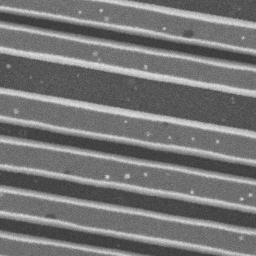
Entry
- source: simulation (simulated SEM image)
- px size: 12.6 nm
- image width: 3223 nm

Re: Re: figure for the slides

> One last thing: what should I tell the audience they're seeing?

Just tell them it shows lines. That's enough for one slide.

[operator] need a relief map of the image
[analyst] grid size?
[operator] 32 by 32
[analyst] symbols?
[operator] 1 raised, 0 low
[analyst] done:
11111111111111111000000000000000
00111111111111111111110000000000
00000000111111111111111111110000
11100000000000111111111111111111
11111111100000000001111111111111
11111111111111000000000001111111
01111111111111111111000000000001
00000001111111111111111111000000
00000000000001111111111111111111
00000000000000000011111111111111
00000000000000000000000011111111
11000000000000000000000000000011
11111111000000000000000000000000
11111111111110000000000000000000
11111111111111111110000000000000
00011111111111111111111110000000
00000000011111111111111111111110
11000000000000011111111111111111
11111111000000000000111111111111
11111111111111000000000000111111
11111111111111111111000000000000
00001111111111111111111110000000
00000000011111111111111111111110
00000000000000001111111111111111
11111100000000000000011111111111
11111111111100000000000000011111
11111111111111111100000000000000
00001111111111111111111100000000
00000000011111111111111111111100
11000000000000011111111111111111
11111111100000000000011111111111
11111111111111100000000000011111